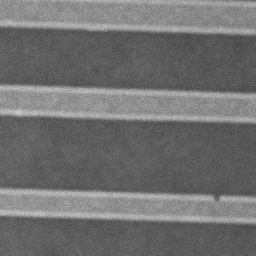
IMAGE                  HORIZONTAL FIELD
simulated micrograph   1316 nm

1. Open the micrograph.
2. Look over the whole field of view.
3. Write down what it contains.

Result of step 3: one or a few lines or trenches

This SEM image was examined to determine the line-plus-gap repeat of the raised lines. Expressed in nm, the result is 508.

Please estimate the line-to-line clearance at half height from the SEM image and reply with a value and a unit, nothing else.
369 nanometers